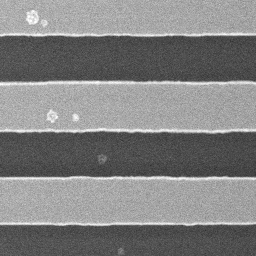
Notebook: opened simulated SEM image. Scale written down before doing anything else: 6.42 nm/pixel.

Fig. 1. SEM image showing lines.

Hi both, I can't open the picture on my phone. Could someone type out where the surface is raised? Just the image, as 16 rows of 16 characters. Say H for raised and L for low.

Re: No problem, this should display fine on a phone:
HHHHHHHHHHHHHHHH
HHHHHHHHHHHHHHHH
LLLLLLLLLLLLLLLL
LLLLLLLLLLLLLLLL
LLLLLLLLLLLLLLLL
HHHHHHHHHHHHHHHH
HHHHHHHHHHHHHHHH
HHHHHHHHHHHHHHHH
LLLLLLLLLLLLLLLL
LLLLLLLLLLLLLLLL
LLLLLLLLLLLLLLLL
HHHHHHHHHHHHHHHH
HHHHHHHHHHHHHHHH
HHHHHHHHHHHHHHHH
LLLLLLLLLLLLLLLL
LLLLLLLLLLLLLLLL